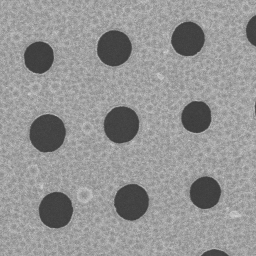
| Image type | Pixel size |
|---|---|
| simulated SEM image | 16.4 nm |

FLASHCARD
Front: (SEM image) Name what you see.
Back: a regular array of holes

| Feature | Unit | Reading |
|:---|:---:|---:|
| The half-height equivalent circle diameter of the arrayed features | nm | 583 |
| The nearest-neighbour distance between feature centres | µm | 1.22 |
